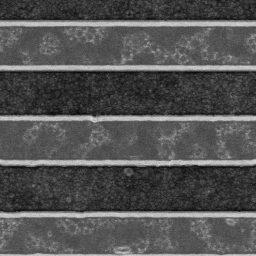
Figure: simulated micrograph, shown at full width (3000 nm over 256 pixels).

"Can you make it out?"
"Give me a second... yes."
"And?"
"one or a few lines or trenches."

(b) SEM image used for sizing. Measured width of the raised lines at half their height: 517 nanometers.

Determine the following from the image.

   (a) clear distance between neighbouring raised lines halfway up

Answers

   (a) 0.604 µm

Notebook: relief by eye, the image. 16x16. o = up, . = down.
................
................
oooooooooooooooo
oooooooooooooooo
................
................
................
oooooooooooooooo
oooooooooooooooo
oooooooooooooooo
................
................
................
oooooooooooooooo
oooooooooooooooo
oooooooooooooooo